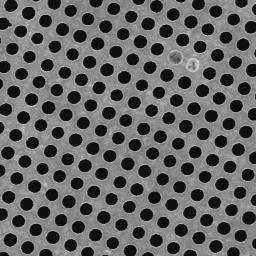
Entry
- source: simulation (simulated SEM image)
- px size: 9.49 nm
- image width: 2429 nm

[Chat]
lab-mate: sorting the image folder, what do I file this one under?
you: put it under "a regular array of holes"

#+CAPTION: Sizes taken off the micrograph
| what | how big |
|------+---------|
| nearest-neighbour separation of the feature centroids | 178 nanometres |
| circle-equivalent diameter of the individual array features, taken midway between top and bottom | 120 nanometers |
